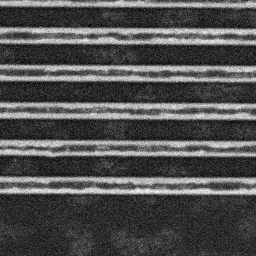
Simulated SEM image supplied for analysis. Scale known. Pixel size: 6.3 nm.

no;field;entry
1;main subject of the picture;parallel lines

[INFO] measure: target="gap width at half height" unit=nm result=161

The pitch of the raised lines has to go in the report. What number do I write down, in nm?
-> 236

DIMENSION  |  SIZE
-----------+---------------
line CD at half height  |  78 nm